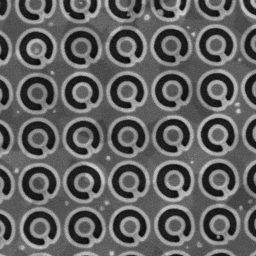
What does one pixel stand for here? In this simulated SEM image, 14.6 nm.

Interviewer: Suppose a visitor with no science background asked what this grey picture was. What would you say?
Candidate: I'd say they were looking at an array of small figures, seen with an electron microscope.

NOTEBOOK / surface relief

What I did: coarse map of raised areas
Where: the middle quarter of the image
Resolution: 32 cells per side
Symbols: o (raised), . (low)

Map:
ooo..ooooooooooooooooooooooooooo
oooooooooooooooooooooooooooooooo
oooo.oooooooooo..oooooooo....ooo
oo.....oooooo......ooooo......oo
o.......oooo........ooo....o...o
...ooo...oo...ooo...ooo..oooo..o
...oooo..oo...oooo..oo...oooo...
...oooo..oo...oooo..oo...oooo...
...ooo...oo...ooo...ooo...ooo..o
.........ooo.....o..ooo.....o..o
o.....ooooooo....ooooooo....oooo
ooo...ooooooooo..ooooooooooooooo
oooooooooooooooooooooooooooooooo
ooooooooooooooo..ooooooooo..oooo
oo.....oooooo......ooooo......oo
o.......oooo........ooo........o
o...oo...ooo...oo...ooo...ooo...
...oooo..oo...oooo...oo..oooo...
...oooo..oo...oooo...oo..oooo...
...oooo..oo...oooo..ooo...ooo...
o...oo...ooo........ooo........o
o.....o.ooooo.....oooooo.....ooo
ooo...oooooooo...ooooooooo..oooo
oooooooooooooooooooooooooooooooo
oooooooooooooooo.ooooooooooooooo
ooo....ooooooo.....ooooo.......o
oo......ooooo.......ooo........o
o........ooo...oo....oo...ooo...
o..oooo..ooo..oooo...oo...ooo...
...oooo...o...oooo...oo...ooo...
...oooo...oo..oooo...oo...ooo...
o...oo...ooo.....o..ooo........o